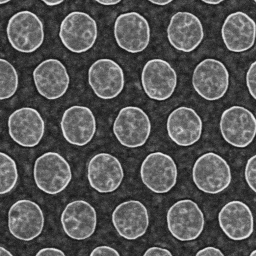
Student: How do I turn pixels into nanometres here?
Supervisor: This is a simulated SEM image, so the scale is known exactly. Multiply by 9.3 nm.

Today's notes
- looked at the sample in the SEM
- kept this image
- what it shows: a regular array of raised bodies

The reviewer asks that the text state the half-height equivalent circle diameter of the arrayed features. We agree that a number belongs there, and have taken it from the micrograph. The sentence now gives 337 nm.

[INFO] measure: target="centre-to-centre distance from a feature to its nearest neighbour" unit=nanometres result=488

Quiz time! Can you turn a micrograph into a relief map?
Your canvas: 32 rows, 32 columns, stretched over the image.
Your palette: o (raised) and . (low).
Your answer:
......o.........................
................................
.oooo...oooo...ooo...oooo...ooo.
.oooo...oooo..oooo...oooo...oooo
.oooo...oooo..ooooo..oooo...oooo
..ooo...oooo...ooo....ooo...oooo
................................
..........................o.....
oo...ooo...oooo...ooo....ooo...o
oo..oooo...oooo...oooo..oooo...o
oo...ooo...oooo...oooo..oooo...o
oo...ooo....ooo...ooo....ooo...o
................................
.........oo.....o............o..
.oooo...oooo...ooo...oooo...oooo
.oooo...oooo..ooooo..oooo...oooo
.oooo...oooo..ooooo..oooo...oooo
..ooo....oo....ooo....ooo...ooo.
................................
o....oo.....oo.....oo....oo.....
oo..oooo...oooo...oooo..oooo...o
oo..ooooo..oooo...oooo..ooooo..o
oo..ooooo..oooo...oooo..ooooo..o
o....ooo....oo.....oo....ooo....
................................
..oo.....oo....ooo....oo.....o..
.oooo...oooo..oooo...oooo...ooo.
.oooo...oooo..oooo...oooo...ooo.
.oooo...oooo...ooo...oooo...ooo.
..oo.....oo....oo.....ooo....oo.
................................
o....ooo....oo....ooo....ooo....